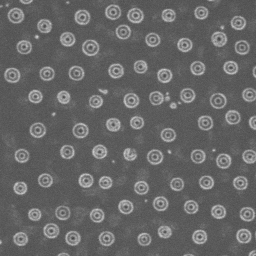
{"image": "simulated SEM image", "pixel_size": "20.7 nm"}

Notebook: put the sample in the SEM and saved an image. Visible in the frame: a regular array of ring-shaped raised bodies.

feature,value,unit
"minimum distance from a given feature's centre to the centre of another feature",0.518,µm